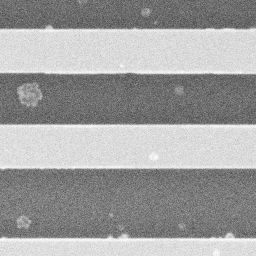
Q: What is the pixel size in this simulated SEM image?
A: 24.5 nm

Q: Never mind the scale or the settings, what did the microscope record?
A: lines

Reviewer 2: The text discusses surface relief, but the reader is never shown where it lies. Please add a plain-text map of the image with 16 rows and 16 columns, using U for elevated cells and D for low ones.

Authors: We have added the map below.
DDDDDDDDDDDDDDDD
DDDDDDDDDDDDDDDD
UUUUUUUUUUUUUUUU
UUUUUUUUUUUUUUUU
UUUUUUUUUUUUUUUU
DDDDDDDDDDDDDDDD
DDDDDDDDDDDDDDDD
DDDDDDDDDDDDDDDD
UUUUUUUUUUUUUUUU
UUUUUUUUUUUUUUUU
DDDDDDDDDDDDDDDD
DDDDDDDDDDDDDDDD
DDDDDDDDDDDDDDDD
DDDDDDDDDDDDDDDD
DDDDDDDDDDDDDDDD
UUUUUUUUUUUUUUUU